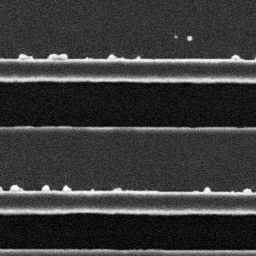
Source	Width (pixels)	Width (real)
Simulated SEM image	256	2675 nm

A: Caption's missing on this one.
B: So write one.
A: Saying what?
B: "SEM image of lines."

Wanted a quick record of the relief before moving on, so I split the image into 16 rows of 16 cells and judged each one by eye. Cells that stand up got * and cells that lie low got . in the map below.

****************
****************
****************
****************
****************
................
................
................
****************
****************
****************
****************
****************
................
................
................